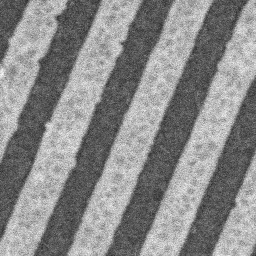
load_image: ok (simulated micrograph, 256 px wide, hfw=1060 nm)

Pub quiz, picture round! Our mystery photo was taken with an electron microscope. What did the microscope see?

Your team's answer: one or a few lines or trenches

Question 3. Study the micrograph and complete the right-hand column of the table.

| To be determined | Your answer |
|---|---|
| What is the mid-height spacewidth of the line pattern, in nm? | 150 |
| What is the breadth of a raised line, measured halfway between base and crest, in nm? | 125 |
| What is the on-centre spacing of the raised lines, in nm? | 277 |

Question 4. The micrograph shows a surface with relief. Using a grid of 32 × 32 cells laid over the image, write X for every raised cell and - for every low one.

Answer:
----XXXX-----XXXX-----XXXX-----X
---XXXX-----XXXXX-----XXXX-----X
---XXXX-----XXXX-----XXXX-----XX
--XXXXX-----XXXX-----XXXX-----XX
--XXXX-----XXXX-----XXXX-----XXX
-XXXXX-----XXXX-----XXXX-----XXX
-XXXX-----XXXXX----XXXXX----XXXX
-XXX------XXXX-----XXXX-----XXXX
-XXXX-----XXXX-----XXXX----XXXXX
XXXX-----XXXX-----XXXX-----XXXX-
XXXX-----XXXX-----XXXX-----XXXX-
XXX-----XXXX-----XXXX-----XXXX--
XXX-----XXXX-----XXXX-----XXXX--
XXX----XXXXX-----XXX------XXXX--
XX-----XXXX-----XXXX-----XXXX---
XX----XXXXX-----XXXX-----XXXX---
X-----XXXX-----XXXX-----XXXX----
X-----XXXX-----XXXX-----XXXX----
-----XXXX-----XXXX-----XXXXX----
-----XXXX-----XXXX-----XXXX-----
-----XXXX----XXXXX----XXXXX-----
----XXXX-----XXXX-----XXXX-----X
----XXXX-----XXXX-----XXXX-----X
---XXXX-----XXXX-----XXXX-----XX
---XXXX-----XXXX-----XXXX-----XX
--XXXX-----XXXXX-----XXXX-----XX
--XXXX-----XXXX-----XXXX-----XXX
-XXXXX-----XXXX-----XXXX-----XXX
-XXXX-----XXXX-----XXXX-----XXXX
-XXXX-----XXXX-----XXXX-----XXXX
XXXX-----XXXX-----XXXXX----XXXXX
XXXX-----XXXX-----XXXX-----XXXX-